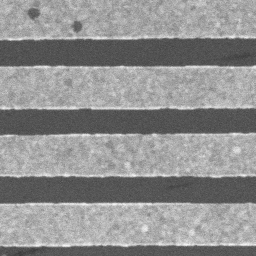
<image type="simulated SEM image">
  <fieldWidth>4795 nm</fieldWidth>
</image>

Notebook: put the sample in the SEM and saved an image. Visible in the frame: lines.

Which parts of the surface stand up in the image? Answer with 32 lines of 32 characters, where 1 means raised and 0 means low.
11111111111111111111111111111111
11111111111111111111111111111111
11111111111111111111111111111111
11111111111111111111111111111111
11111111111111111111111111111111
00000000000000000000000000000000
00000000000000000000000000000000
00000000000000000000000000000000
00111111111000110000100111111001
11111111111111111111111111111111
11111111111111111111111111111111
11111111111111111111111111111111
11111111111111111111111111111111
11111111111111111111101110000000
00000000000000000000000000000000
00000000000000000000000000000000
00000000000000000000000000000000
11111111111111111111111111111111
11111111111111111111111111111111
11111111111111111111111111111111
11111111111111111111111111111111
11111111111111111111111111111111
00000000000000000000000000000000
00000000000000000000000000000000
00000000000000000000000000000000
00000000000000000000000000000000
11111111111111111111111111111111
11111111111111111111111111111111
11111111111111111111111111111111
11111111111111111111111111111111
11111111111111111111111111111111
00000000000000000000000000000000